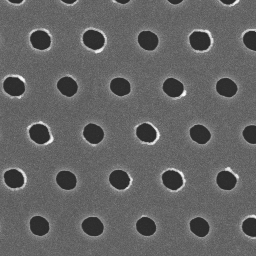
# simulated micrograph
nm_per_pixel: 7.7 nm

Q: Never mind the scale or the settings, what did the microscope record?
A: a regular array of holes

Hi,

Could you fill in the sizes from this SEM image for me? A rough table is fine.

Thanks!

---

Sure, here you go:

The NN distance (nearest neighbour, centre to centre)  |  0.406 microns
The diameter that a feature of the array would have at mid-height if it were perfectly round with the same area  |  156 nm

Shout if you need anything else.